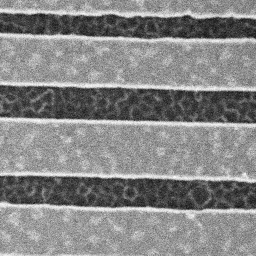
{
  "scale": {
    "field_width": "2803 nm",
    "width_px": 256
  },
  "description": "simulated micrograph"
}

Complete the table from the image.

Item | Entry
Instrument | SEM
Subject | one or a few lines or trenches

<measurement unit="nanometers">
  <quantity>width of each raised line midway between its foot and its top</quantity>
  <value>562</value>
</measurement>